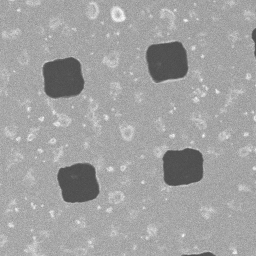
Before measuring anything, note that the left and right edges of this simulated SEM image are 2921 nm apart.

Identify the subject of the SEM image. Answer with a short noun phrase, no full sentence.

holes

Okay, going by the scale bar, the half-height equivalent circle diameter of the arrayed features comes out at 474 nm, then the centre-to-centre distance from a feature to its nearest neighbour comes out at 1200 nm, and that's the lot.